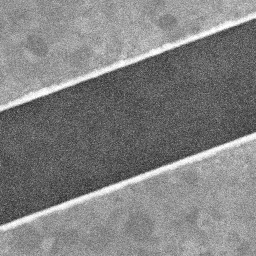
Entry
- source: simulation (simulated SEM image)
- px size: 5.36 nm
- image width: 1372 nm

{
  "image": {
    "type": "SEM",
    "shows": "one or a few lines or trenches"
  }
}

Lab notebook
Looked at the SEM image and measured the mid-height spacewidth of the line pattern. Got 0.597 microns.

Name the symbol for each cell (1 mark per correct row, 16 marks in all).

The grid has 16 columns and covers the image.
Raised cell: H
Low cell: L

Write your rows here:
HHHHHHHHHHHHHHHH
HHHHHHHHHHHHHHHL
HHHHHHHHHHHHLLLL
HHHHHHHHHLLLLLLL
HHHHHHLLLLLLLLLL
HHHHLLLLLLLLLLLL
HLLLLLLLLLLLLLLL
LLLLLLLLLLLLLLLL
LLLLLLLLLLLLLLLL
LLLLLLLLLLLLLHHH
LLLLLLLLLLHHHHHH
LLLLLLLLHHHHHHHH
LLLLLHHHHHHHHHHH
LLHHHHHHHHHHHHHH
HHHHHHHHHHHHHHHH
HHHHHHHHHHHHHHHH